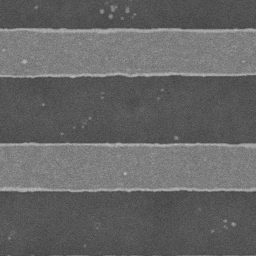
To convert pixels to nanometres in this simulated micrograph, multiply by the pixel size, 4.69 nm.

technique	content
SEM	lines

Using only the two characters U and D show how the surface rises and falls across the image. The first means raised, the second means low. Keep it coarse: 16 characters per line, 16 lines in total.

DDDDDDDDDDDDDDDD
DDDDDDDDDDDDDDDD
UUUUUUUUUUUUUUUU
UUUUUUUUUUUUUUUU
UUUUUUUUUUUUUUUU
DDDDDDDDDDDDDDDD
DDDDDDDDDDDDDDDD
DDDDDDDDDDDDDDDD
DDDDDDDDDDDDDDDD
UUUUUUUUUUUUUUUU
UUUUUUUUUUUUUUUU
UUUUUUUUUUUUUUUU
DDDDDDDDDDDDDDDD
DDDDDDDDDDDDDDDD
DDDDDDDDDDDDDDDD
DDDDDDDDDDDDDDDD